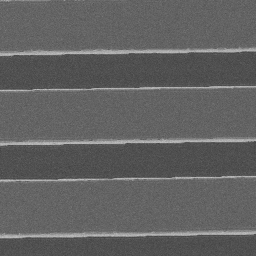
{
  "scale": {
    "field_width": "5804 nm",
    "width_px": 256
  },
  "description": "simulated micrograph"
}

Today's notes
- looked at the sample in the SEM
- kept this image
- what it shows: lines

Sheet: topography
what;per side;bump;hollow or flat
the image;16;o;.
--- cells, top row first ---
oooooooooooooooo
oooooooooooooooo
oooooooooooooooo
................
................
.........ooooooo
oooooooooooooooo
oooooooooooooooo
oooooooooooooooo
................
................
oooooooooooooooo
oooooooooooooooo
oooooooooooooooo
oooooooooooooooo
................